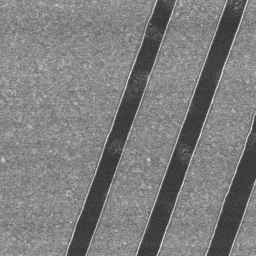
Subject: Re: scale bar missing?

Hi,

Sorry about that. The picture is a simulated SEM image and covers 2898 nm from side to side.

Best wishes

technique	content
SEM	one or a few lines or trenches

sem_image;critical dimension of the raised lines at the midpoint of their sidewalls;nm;224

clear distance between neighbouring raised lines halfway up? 531 nm